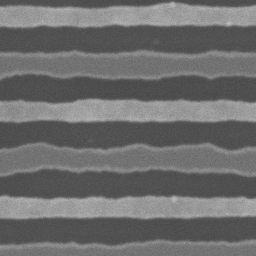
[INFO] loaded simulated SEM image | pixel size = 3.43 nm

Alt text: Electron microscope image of lines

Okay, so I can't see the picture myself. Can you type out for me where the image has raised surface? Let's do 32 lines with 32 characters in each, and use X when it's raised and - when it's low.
--------------------XXX---------
XXXXXXXXXXXXXXXXXXXXXXXXXXXXXXXX
XXXXXXXXXXXXXXXXXXXXXXXXXXXXXXXX
--------------------------------
--------------------------------
--------------------------------
---------X------XXXX------XX----
XXXXXXXXXXXXXXXXXXXXXXXXXXXXXXXX
XXXXXXXXXXXXXXXXXXXXXXXXXXXXXXXX
X-----XXX--XXXXXXXXXXX---XXX---X
--------------------------------
--------------------------------
----------XXX-------------------
XXXXXXXXXXXXXXXXXXXXXXXXXXXXXXXX
XXXXXXXXXXXXXXXXXXXXXXXXXXXXXXXX
--------------------------------
--------------------------------
--------------------------------
--XXXXXXX-----XXXXXXXXXXXXXX--XX
XXXXXXXXXXXXXXXXXXXXXXXXXXXXXXXX
XXXXXXXXXXXXXXXXXXXXXXXXXXXXXXXX
XXXX-----X----XX-------XXXXXXXXX
--------------------------------
--------------------------------
--------------------------------
XXXXXXXXXXXXXXXXXXXXXXXXXXXXXXXX
XXXXXXXXXXXXXXXXXXXXXXXXXXXXXXXX
--------------------------------
--------------------------------
--------------------------------
----XXXXXX------XXXXXXXXXXXXXXXX
XXXXXXXXXXXXXXXXXXXXXXXXXXXXXXXX